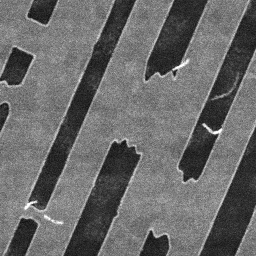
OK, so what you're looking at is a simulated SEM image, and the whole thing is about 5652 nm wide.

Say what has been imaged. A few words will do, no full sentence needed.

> one or a few lines or trenches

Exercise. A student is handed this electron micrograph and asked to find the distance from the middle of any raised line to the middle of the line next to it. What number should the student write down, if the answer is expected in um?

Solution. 1.42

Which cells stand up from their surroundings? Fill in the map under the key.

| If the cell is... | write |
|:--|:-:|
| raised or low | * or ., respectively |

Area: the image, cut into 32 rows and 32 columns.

****...*******...*****....*****.
****...*******..*****....*****..
****..*******...*****....*****..
*************...****.....*****..
************...*****....*****...
************...****.....*****...
*..*********..*****....*****....
*...*******...****.....*****...*
....*******..*****....******...*
...*******...*****.********....*
*..*******...**************...**
*********...**************....**
*********...**************...***
.********..**************....***
.*******...**************...****
.*******..**************....****
*******...**************...*****
*******...**************...****.
******...*****...******....****.
******...****.....*****...****..
*****...*****....*****....****..
*****...****.....******..****...
*****..*****....*******..****...
****...****.....************....
****..*****....*************....
****..*****....*************....
**********.....************.....
***.******....*************....*
**...****.....************.....*
**..*****....*****...*****.....*
*...*****....*****...****.....**
*..*****....******...****.....**